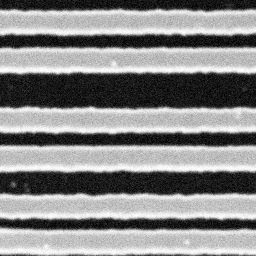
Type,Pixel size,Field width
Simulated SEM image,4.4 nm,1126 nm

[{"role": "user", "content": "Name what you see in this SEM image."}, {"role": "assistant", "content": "lines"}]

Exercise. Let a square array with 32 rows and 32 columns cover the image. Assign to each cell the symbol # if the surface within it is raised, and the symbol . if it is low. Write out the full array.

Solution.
................................
#########################..#####
################################
################################
................................
................................
################################
################################
################################
................................
................................
................................
................................
...##......#........#...........
################################
################################
......##..##.##..#.....##.......
................................
################################
################################
################################
................................
................................
................................
##.#.######..#######.##.########
################################
################################
................................
................................
################################
################################
################################